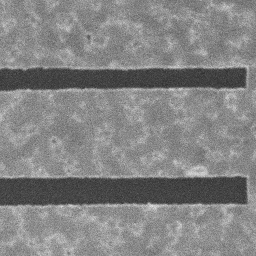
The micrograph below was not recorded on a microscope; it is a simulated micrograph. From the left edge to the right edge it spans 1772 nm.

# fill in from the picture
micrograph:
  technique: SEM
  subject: one or a few lines or trenches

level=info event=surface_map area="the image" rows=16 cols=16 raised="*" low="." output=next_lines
****************
****************
****************
****************
...............*
...............*
****************
****************
****************
****************
****************
...............*
...............*
****************
****************
****************